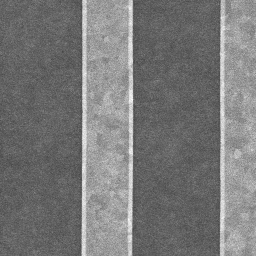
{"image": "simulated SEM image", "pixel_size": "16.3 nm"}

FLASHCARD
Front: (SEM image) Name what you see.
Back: one or a few lines or trenches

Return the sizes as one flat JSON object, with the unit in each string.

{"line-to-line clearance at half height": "1490 nanometres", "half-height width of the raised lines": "0.767 µm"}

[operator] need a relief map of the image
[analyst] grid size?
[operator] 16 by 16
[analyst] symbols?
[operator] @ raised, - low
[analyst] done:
-----@@@------@@
-----@@@------@@
-----@@@------@@
-----@@@------@@
-----@@@------@@
-----@@@------@@
-----@@@------@@
-----@@@------@@
-----@@@------@@
-----@@@------@@
-----@@@------@@
-----@@@------@@
-----@@@------@@
-----@@@------@@
-----@@@------@@
-----@@@------@@